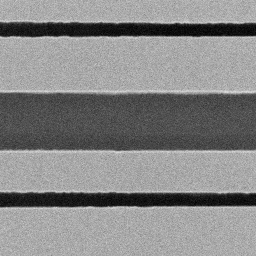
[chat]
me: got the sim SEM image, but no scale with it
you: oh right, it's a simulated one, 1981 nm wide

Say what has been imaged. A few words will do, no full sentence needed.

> lines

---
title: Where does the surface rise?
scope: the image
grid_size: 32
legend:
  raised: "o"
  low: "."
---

oooooooooooooooooooooooooooooooo
oooooooooooooooooooooooooooooooo
oooooooooooooooooooooooooooooooo
................................
................................
oooooooooooooooooooooooooooooooo
oooooooooooooooooooooooooooooooo
oooooooooooooooooooooooooooooooo
oooooooooooooooooooooooooooooooo
oooooooooooooooooooooooooooooooo
oooooooooooooooooooooooooooooooo
..............o..o..o.ooo..ooooo
................................
................................
................................
................................
................................
................................
................................
oooooooooooooooooooooooooooooooo
oooooooooooooooooooooooooooooooo
oooooooooooooooooooooooooooooooo
oooooooooooooooooooooooooooooooo
oooooooooooooooooooooooooooooooo
.......................oooooooo.
................................
oooooooooooooooooooooooooooooooo
oooooooooooooooooooooooooooooooo
oooooooooooooooooooooooooooooooo
oooooooooooooooooooooooooooooooo
oooooooooooooooooooooooooooooooo
oooooooooooooooooooooooooooooooo